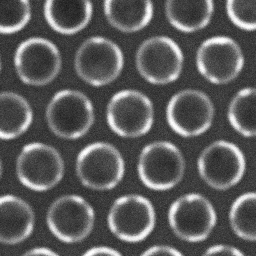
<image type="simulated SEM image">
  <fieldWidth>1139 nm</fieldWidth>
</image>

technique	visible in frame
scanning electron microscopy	a regular array of raised bodies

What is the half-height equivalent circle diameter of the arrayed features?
202 nm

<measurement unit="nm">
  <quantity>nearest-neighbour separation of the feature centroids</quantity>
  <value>268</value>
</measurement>